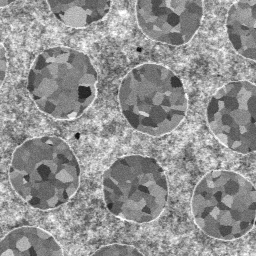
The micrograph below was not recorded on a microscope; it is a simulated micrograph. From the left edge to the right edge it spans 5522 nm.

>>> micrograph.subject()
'raised bodies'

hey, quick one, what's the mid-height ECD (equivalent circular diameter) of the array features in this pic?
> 1540 nm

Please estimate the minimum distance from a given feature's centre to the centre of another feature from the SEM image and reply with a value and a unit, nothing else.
1970 nm